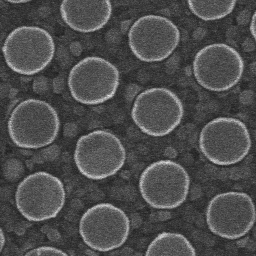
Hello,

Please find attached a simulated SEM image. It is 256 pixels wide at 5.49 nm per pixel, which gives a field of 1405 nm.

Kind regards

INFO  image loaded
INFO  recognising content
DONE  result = a regular array of raised bodies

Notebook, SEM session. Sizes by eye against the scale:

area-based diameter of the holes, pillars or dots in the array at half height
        262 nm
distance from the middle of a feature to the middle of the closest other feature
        0.392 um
